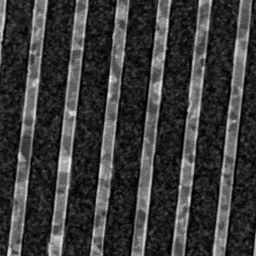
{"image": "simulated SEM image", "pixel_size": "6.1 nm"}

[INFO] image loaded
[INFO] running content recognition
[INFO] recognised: parallel lines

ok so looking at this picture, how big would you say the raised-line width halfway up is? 0.0636 µm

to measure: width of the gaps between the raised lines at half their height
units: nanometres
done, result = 183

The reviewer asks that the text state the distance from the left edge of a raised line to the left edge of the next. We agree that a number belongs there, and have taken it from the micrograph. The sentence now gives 0.248 µm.